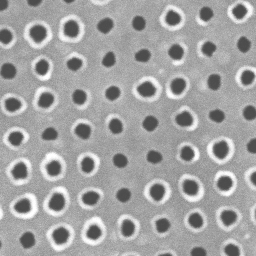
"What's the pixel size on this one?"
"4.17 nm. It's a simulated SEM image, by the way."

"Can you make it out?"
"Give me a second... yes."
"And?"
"a regular array of holes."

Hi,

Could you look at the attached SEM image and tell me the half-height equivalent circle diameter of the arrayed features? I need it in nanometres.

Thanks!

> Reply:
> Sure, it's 62.5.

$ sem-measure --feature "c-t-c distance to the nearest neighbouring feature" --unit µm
0.138